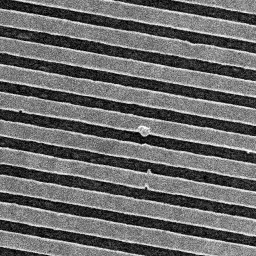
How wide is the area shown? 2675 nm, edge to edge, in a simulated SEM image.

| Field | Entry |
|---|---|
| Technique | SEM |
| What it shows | parallel lines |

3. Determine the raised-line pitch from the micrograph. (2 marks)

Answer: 27.3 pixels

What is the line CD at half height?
163 nm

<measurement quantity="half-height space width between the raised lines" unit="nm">125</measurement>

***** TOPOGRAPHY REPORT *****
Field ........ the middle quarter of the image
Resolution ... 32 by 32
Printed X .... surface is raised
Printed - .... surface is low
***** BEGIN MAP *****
----XXXXXXXXXXXXXXXXXXXXX-------
----------XXXXXXXXXXXXXXXXXXXX--
---------------XXXXXXXXXXXXXXXXX
XXX------------------XXXXXXXXXXX
XXXXXXXXX------------------XXXXX
XXXXXXXXXXXXXX------------------
XXXXXXXXXXXXXXXXXXXX------------
----XXXXXXXXXXXXXXXXXXXXXX------
----------XXXXXXXXXXXXXXXXXXXXX-
--------------XXXXXXXXXXXXXXXXXX
XXXX-----------------XXXXXXXXXXX
XXXXXXXXXX-----------------XXXXX
XXXXXXXXXXXXXXXX----------------
XXXXXXXXXXXXXXXXXXXX------------
-----XXXXXXXXXXXXXXXXXXXXX------
-----------XXXXXXXXXXXXXXXXXXXX-
----------------XXXXXXXXXXXXXXXX
XXXX---------------XX-XXXXXXXXXX
XXXXXXXXX-------------------XXXX
XXXXXXXXXXXXXXXX----------------
XXXXXXXXXXXXXXXXXXXXXX----------
------XXXXXXXXXXXXXXXXXXXXX-----
-----------XXXXXXXXXXXXXXXXXXXXX
----------------XXXXXXXXXXXXXXXX
XXXX------------------XXXXXXXXXX
XXXXXXXXXX------------------XXXX
XXXXXXXXXXXXXXXX----------------
-XXXXXXXXXXXXXXXXXXXXX----------
------XXXXXXXXXXXXXXXXXXXXX-----
------------XXXXXXXXXXXXXXXXXXXX
----------------XXXXXXXXXXXXXXXX
XXXXX-----------------XXXXXXXXXX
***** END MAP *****